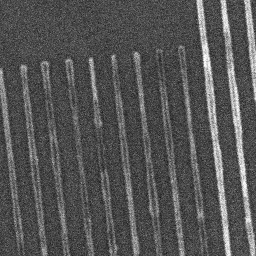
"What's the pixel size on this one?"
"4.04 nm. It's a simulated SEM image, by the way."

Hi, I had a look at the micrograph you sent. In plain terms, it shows parallel lines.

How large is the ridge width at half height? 0.0201 µm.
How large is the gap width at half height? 72.2 nanometers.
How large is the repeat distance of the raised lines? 93.4 nanometers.